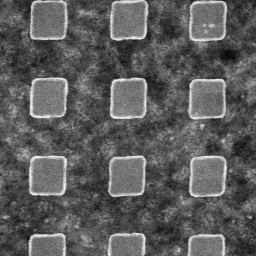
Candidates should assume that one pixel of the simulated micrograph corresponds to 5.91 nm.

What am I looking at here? a regular array of raised bodies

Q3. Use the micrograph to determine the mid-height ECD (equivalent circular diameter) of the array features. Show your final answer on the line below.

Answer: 243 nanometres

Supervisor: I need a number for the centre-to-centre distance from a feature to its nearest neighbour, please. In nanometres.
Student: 458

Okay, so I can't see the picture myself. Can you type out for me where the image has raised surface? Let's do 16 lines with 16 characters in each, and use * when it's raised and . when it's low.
..**...**...**..
..**...**...**..
............*...
................
................
..**...**...**..
..**...**...**..
................
................
................
..**...**...**..
..**...**...**..
................
................
................
..**...**...**..